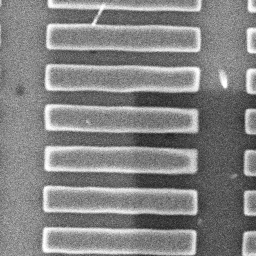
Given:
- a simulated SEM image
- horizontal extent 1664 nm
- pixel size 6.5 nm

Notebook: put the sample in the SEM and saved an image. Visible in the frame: groups of lines, slits or small figures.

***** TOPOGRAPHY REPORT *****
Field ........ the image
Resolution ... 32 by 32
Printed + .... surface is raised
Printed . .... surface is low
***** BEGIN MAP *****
......+++++++++++++++++++......+
................................
................................
......+++++++++++++++++++.......
......+++++++++++++++++++......+
......+++++++++++++++++++......+
...............................+
................................
......+++++++++++++.............
......+++++++++++++++++++......+
......+++++++++++++++++++......+
...............................+
................................
......++++++++++................
......++++++++++++++++++.......+
......++++++++++++++++++.......+
...............................+
................................
.........+++....++..............
......++++++++++++++++++.......+
......++++++++++++++++++.......+
....................++.........+
................................
......++++......................
......++++++++++++++++++.......+
......+++++++++++++++++++......+
...............+++++++++.......+
................................
................................
......++++++++++++++++++.......+
......++++++++++++++++++......++
........++++++++++++++++......++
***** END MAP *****